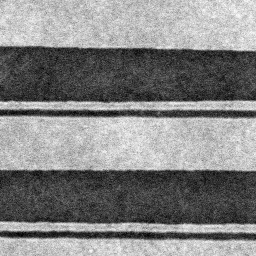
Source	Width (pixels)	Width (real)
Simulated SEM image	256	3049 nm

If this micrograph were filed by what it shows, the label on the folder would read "lines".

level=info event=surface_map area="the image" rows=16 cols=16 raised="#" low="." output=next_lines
################
################
################
................
................
................
################
################
################
################
################
................
................
................
################
################